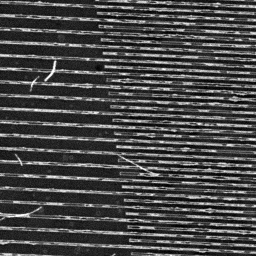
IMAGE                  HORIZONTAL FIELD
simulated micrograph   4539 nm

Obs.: parallel lines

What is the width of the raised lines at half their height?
0.0443 microns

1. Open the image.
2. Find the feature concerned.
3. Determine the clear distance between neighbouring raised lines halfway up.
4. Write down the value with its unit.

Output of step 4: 3.87 pixels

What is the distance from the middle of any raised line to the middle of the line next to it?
118 nanometers